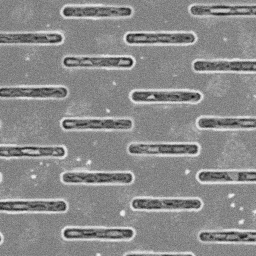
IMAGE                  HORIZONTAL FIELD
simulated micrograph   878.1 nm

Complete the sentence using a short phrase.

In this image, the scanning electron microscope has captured a regular array of holes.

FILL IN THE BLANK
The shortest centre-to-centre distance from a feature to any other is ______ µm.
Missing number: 0.184